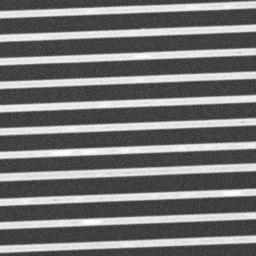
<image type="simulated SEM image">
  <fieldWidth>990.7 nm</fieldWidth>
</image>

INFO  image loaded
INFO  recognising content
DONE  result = parallel lines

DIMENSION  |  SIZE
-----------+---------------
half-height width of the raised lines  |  23.7 nm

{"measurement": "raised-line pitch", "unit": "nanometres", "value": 90.6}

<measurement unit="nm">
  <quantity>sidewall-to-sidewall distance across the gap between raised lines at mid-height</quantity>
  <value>67.1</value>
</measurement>